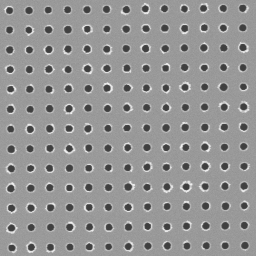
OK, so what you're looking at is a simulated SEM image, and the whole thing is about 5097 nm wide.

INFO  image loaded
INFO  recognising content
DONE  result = a regular array of holes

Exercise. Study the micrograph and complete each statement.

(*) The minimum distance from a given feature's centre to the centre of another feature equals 383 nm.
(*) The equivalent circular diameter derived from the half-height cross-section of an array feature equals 0.14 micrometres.